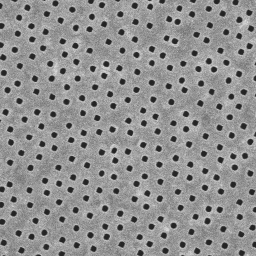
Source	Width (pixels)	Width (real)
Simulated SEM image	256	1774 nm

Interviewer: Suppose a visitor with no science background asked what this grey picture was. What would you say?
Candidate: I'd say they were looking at a regular array of holes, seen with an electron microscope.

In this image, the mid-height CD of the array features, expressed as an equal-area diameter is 43.6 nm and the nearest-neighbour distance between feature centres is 95.5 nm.